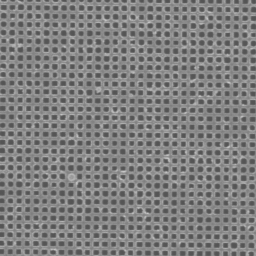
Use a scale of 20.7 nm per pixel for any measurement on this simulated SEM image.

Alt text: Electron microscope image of a regular array of holes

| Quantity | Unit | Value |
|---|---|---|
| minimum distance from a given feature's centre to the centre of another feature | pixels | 8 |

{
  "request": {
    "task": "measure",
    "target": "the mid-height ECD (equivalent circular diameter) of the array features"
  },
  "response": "0.123 micrometres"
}